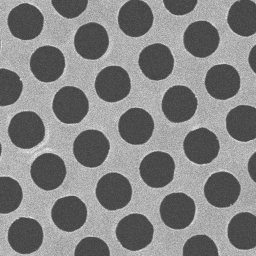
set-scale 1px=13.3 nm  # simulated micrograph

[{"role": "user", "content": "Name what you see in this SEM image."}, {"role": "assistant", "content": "a regular array of holes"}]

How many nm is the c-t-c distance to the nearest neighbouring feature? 632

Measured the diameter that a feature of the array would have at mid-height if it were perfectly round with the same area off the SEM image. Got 0.488 micrometres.